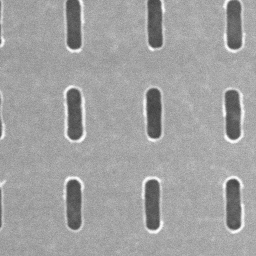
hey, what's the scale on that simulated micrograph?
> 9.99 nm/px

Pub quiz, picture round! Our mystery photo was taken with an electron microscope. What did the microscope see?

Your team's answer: holes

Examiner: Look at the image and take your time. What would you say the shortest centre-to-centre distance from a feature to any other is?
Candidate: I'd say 78.7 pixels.